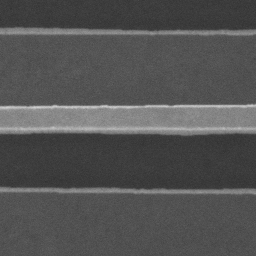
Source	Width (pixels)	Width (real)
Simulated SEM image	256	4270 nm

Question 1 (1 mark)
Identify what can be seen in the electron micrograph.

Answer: lines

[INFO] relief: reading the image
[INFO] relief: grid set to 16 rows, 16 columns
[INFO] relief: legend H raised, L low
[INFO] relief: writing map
LLLLLLLLLLLLLLLL
LLLLLLLLLLLLLLLL
HHHHHHHHHHHHHHHH
HHHHHHHHHHHHHHHH
HHHHHHHHHHHHHHHH
HHHHHHHHHHHHHHHH
HHHHHHHHHHHHHHHH
HHHHHHHHHHHHHHHH
LLLLLLLLLLLLLLLL
LLLLLLLLLLLLLLLL
LLLLLLLLLLLLLLLL
LLLLLLLLLLLLLLLL
HHHHHHHHHHHHHHHH
HHHHHHHHHHHHHHHH
HHHHHHHHHHHHHHHH
HHHHHHHHHHHHHHHH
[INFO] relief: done